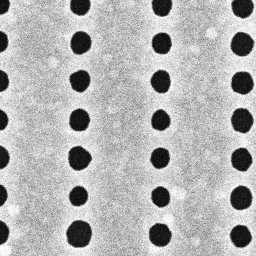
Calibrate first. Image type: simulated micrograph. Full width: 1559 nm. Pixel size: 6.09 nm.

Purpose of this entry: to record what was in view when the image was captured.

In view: a regular array of holes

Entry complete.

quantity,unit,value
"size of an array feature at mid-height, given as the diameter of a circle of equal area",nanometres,139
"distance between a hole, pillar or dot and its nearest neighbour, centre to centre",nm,232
